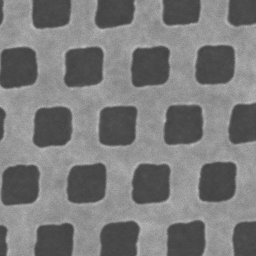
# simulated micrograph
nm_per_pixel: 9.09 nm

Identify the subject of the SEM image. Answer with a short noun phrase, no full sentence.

a regular array of holes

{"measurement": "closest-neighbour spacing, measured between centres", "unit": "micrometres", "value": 0.594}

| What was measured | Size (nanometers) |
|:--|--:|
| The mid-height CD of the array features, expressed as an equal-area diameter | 390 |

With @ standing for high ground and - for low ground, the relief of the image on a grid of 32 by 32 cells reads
@@@@-----@@@-----@@@-----@@@@---
@@@@-----@@@-----@@@-----@@@@---
@@@@-----@@@-----@@@-----@@@----
@@@@@--@@@@@@-@@@@@@@@@@@@@@@@@@
@@@@@@@@@@@@@@@@@@@@@@@@@@@@@@@@
@@@@@@@@@@@@@@@@@@@@@@@@@@@@@@@@
----@@@@-----@@@@----@@@@----@@@
-----@@@-----@@@-----@@@@----@@@
-----@@@-----@@@-----@@@-----@@@
-----@@@-----@@@-----@@@-----@@@
----@@@@----@@@@@---@@@@@---@@@@
@@@@@@@@@@@@@@@@@@@@@@@@@@@@@@@@
@@@@@@@@@@@@@@@@@@@@@@@@@@@@@@@@
@@@@@---@@@@@----@@@@----@@@@---
-@@@-----@@@-----@@@@----@@@@---
-@@@-----@@@-----@@@@----@@@@---
-@@@-----@@@-----@@@-----@@@@---
@@@@-----@@@-----@@@@----@@@@---
@@@@@@@@@@@@@@@@@@@@@@@@@@@@@@@@
@@@@@@@@@@@@@@@@@@@@@@@@@@@@@@@@
@@@@@@@@@@@--@@@@@-@@@@@@@---@@@
-----@@@@----@@@@----@@@@-----@@
-----@@@-----@@@-----@@@@-----@@
-----@@@-----@@@-----@@@@----@@@
-----@@@-----@@@-----@@@@----@@@
----@@@@@@@@@@@@@--@@@@@@@@@@@@@
@@@@@@@@@@@@@@@@@@@@@@@@@@@@@@@@
@@@@@@@@@@@@@@@@@@@@@@@@-@@@@@@@
-@@@@----@@@@----@@@@-----@@@---
-@@@-----@@@-----@@@@-----@@@---
-@@@-----@@@@----@@@@-----@@@---
-@@@-----@@@@----@@@@-----@@@---